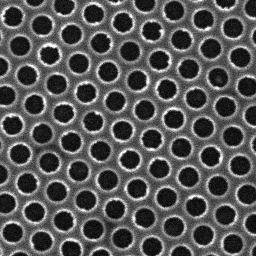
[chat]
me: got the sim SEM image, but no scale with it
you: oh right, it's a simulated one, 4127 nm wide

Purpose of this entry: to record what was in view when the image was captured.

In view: a regular array of holes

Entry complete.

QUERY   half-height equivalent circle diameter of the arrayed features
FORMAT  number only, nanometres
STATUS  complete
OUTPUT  328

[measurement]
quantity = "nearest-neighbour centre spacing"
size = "0.481 micrometres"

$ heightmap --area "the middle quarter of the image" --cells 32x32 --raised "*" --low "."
*.....***....*********....***...
**....***.....*********.*****...
*********....***....*********...
*********....***.....*********..
.*********.*****.....***...*****
.***...*********....****....****
***.....*********..****.....****
***.....***...*********.....***.
***.....***....*********...***..
****...***.....****...*********.
..*********....***....*********.
..*********...****.....****.****
...***..**********.....**.....**
..***.....*********...***.....**
.****.....***...*********.....**
*****.....**.....*********....**
******...***.....****..*********
*..*********.....***....********
....*********...***.....********
....****..**********.....**....*
....***....*********....***.....
...****.....***************.....
*******.....***....********.....
*******....***.....*************
**...*********.....***....******
**....*********...***.....******
*.....****..*********.....***...
*.....***....*********....***...
**....**......*********..***....
********......**....*********...
*********....***.....*********..
.*********..****.....***...*****